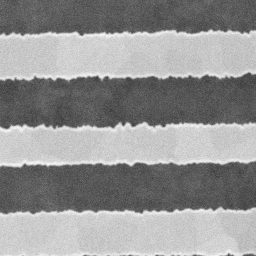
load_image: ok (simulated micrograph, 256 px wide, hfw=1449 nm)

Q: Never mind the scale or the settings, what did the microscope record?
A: lines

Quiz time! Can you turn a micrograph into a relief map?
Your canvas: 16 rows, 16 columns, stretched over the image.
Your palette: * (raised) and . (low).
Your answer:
................
................
****************
****************
****************
................
................
................
****************
****************
................
................
................
****************
****************
****************